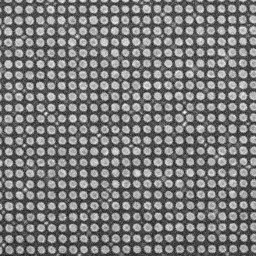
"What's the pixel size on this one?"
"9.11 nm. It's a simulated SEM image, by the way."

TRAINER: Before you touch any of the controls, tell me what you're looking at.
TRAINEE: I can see a regular array of raised bodies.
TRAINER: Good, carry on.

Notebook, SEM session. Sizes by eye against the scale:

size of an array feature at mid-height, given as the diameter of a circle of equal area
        65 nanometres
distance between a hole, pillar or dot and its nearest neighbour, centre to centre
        0.0963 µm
